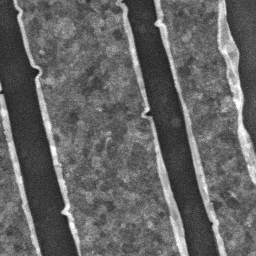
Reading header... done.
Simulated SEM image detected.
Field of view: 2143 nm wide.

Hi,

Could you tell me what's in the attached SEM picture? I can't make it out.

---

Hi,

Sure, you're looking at one or a few lines or trenches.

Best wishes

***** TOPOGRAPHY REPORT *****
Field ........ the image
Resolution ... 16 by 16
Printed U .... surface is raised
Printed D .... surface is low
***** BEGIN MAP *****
DUUUUUUUDDUUUUDD
DUUUUUUUDDUUUUDD
DUUUUUUUDDUUUUDD
DDUUUUUUDDDUUUDD
DDUUUUUUUDDUUUUD
DDUUUUUUUDDUUUUD
DDDUUUUUUDDUUUUD
DDDUUUUUUDDDUUUD
UDDUUUUUUUDDUUUD
UDDUUUUUUUDDUUUU
UDDDUUUUUUDDUUUU
UDDDUUUUUUDDDUUU
UUDDUUUUUUUDDUUU
UUDDUUUUUUUDDUUU
UUDDDUUUUUUDDUUU
UUDDDUUUUUUDDDUU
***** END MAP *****